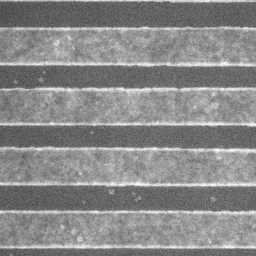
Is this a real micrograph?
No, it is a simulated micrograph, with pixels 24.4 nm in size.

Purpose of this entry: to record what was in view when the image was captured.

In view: lines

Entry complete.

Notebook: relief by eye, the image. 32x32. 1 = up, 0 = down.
00000000000000000000000000000000
00000000000000000000000000000000
00000000000000000000000000000000
00000000000000000000000000010000
11111111111111111111111111111111
11111111111111111111111111111111
11111111111111111111111111111111
11111111111111111111111111111111
00000000000000000000000000000000
00000000000000000000000000000000
00000000000000000000000000000000
11111111111111111111111111111111
11111111111111111111111111111111
11111111111111111111111111111111
11111111111111111111111111111111
11111111111111111111111111111111
00000000000000000000000000000000
00000000000000000000000000000000
00000000000000000000000000000000
11111111111111111111111111111111
11111111111111111111111111111111
11111111111111111111111111111111
11111111111111111111111111111111
00000000000000000000000000000000
00000000000000000000000000000000
00000000000000000000000000000000
11111111110000011111011000000000
11111111111111111111111111111111
11111111111111111111111111111111
11111111111111111111111111111111
11111111111111111111111111111111
00000000000000000000000000000000